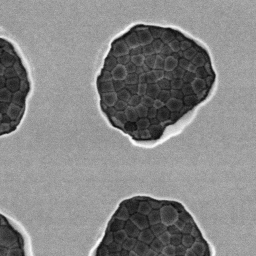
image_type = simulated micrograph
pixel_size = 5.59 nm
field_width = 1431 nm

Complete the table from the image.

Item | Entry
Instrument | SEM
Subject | holes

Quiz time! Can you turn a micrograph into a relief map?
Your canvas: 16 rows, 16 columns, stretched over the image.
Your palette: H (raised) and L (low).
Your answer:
HHHHHHHHHHHHHHHH
HHHHHHHHHHHHHHHH
HHHHHHHLLLLLHHHH
LHHHHHHLLLLLLHHH
LLHHHHLLLLLLLHHH
LLHHHHLLLLLLLHHH
LLHHHHLLLLLLLHHH
LHHHHHHLLLLHHHHH
HHHHHHHHLLHHHHHH
HHHHHHHHHHHHHHHH
HHHHHHHHHHHHHHHH
HHHHHHHHHHHHHHHH
HHHHHHHHLLHHHHHH
HHHHHHHLLLLLHHHH
LHHHHHHLLLLLLHHH
LLHHHHLLLLLLLHHH